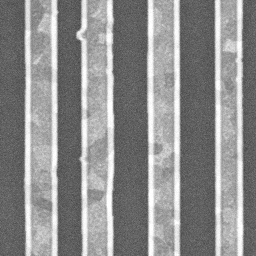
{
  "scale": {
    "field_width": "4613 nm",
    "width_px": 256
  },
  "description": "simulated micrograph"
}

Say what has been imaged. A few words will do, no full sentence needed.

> one or a few lines or trenches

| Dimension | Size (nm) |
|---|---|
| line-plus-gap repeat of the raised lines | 1130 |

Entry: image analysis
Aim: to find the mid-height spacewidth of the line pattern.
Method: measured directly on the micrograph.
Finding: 0.745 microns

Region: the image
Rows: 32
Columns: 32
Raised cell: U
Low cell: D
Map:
DDDDUUUDDDDUUUDDDDDUUUDDDDDUUUDD
DDDDUUUDDDDUUUDDDDDUUUDDDDDUUUDD
DDDDUUUDDDDUUUDDDDDUUUDDDDDUUUDD
DDDDUUUDDDDUUUDDDDDUUUDDDDDUUUDD
DDDDUUUDDDUUUDDDDDDUUUDDDDDUUUDD
DDDDUUUDDDDUUUDDDDDUUUDDDDDUUUDD
DDDDUUUDDDDUUUDDDDDUUUDDDDDUUUDD
DDDDUUUDDDDUUUDDDDDUUUDDDDDUUUDD
DDDDUUUDDDDUUUDDDDDUUUDDDDDUUUDD
DDDDUUUDDDDUUUDDDDDUUUDDDDDUUUDD
DDDDUUUDDDDUUUDDDDDUUUDDDDDUUUDD
DDDDUUUDDDDUUUDDDDDUUUDDDDDUUUDD
DDDDUUUDDDDUUUDDDDDUUUDDDDDUUUDD
DDDDUUUDDDDUUUDDDDDUUUDDDDDUUUDD
DDDDUUUDDDDUUUDDDDDUUUDDDDDUUUDD
DDDDUUUDDDDUUUDDDDDUUUDDDDDUUUDD
DDDDUUUDDDDUUUDDDDDUUUDDDDDUUUDD
DDDDUUUDDDDUUUDDDDDUUUDDDDDUUUDD
DDDDUUUDDDDUUUDDDDDUUUDDDDDUUUDD
DDDDUUUDDDDUUUDDDDDUUUDDDDDUUUDD
DDDDUUUDDDDUUUDDDDDUUUDDDDDUUUDD
DDDDUUUDDDDUUUDDDDDUUUDDDDDUUUDD
DDDDUUUDDDDUUUDDDDDUUUDDDDDUUUDD
DDDDUUUDDDDUUUDDDDDUUUDDDDDUUUDD
DDDDUUUDDDDUUUDDDDDUUUDDDDDUUUDD
DDDDUUUDDDDUUUDDDDDUUUDDDDDUUUDD
DDDDUUUDDDDUUUDDDDDUUUDDDDDUUUDD
DDDDUUUDDDDUUUDDDDDUUUDDDDDUUUDD
DDDDUUUDDDDUUUDDDDDUUUDDDDDUUUDD
DDDDUUUDDDDUUUDDDDDUUUDDDDDUUUDD
DDDDUUUDDDDUUUDDDDDUUUDDDDDUUUDD
DDDDUUUDDDDUUUDDDDDUUUDDDDDUUUDD